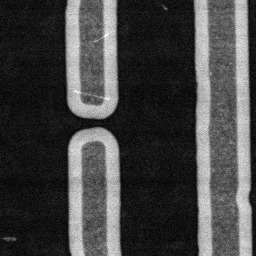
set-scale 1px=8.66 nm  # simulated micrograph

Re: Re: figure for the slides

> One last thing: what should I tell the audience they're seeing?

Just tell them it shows one or a few lines or trenches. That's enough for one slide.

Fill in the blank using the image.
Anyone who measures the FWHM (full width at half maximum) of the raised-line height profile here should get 339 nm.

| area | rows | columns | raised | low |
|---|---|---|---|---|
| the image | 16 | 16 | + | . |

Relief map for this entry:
.....++......++.
.....++......++.
.....++......++.
.....++......++.
.....++......++.
.....++......++.
.....++......++.
.............++.
.............++.
.....++......++.
.....++......++.
.....++......++.
.....++......++.
.....++......++.
.....++......++.
.....++......++.